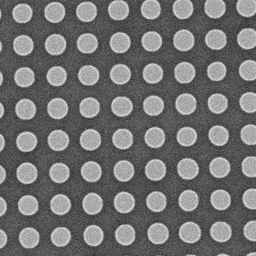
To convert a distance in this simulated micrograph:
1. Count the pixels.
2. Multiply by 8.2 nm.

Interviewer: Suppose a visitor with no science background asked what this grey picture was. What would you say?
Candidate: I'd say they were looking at an array of small figures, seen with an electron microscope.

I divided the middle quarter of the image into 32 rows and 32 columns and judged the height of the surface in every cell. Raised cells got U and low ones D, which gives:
DDDDDDDDDDDDDUUDDDDDDUUUDDDDUUUU
DDDDUUUUDDDDUUUUDDDDUUUUDDDDUUUU
DDDDUUUUUDDDUUUUUDDDUUUUUDDDUUUU
DDDDUUUUUDDDUUUUDDDDUUUUDDDDUUUU
DDDDUUUUDDDDDUUUDDDDDUUDDDDDDUUD
DDDDDDDDDDDDDDDDDDDDDDDDDDDDDDDD
DDDDDDDDDDDDDDDDDDDDDDDDDDDDDDDD
DDDDDDDDDDDDDDDDDDDDDDDDDDDDDDUD
DDDDDDDDDDDDDUUUDDDDDUUUDDDDUUUU
DDDDUUUUDDDDUUUUUDDDUUUUUDDDUUUU
UDDDUUUUUDDDUUUUUDDDUUUUUDDDUUUU
UDDDUUUUUDDDUUUUUDDDUUUUDDDDUUUU
UDDDDUUUDDDDDUUUDDDDDUUUDDDDDDDD
DDDDDDDDDDDDDDDDDDDDDDDDDDDDDDDD
DDDDDDDDDDDDDDDDDDDDDDDDDDDDDDDD
DDDDDDDDDDDDDDDDDDDDDDDDDDDDDDDD
DDDDDDUDDDDDDDUUDDDDDUUUDDDDDUUU
UDDDDUUUUDDDDUUUUDDDUUUUUDDDUUUU
UDDDUUUUUDDDUUUUUDDDUUUUUDDDUUUU
UDDDUUUUUDDDUUUUUDDDUUUUUDDDDUUU
UDDDDUUUUDDDDUUUDDDDDUUUDDDDDDDD
DDDDDDDDDDDDDDDDDDDDDDDDDDDDDDDD
DDDDDDDDDDDDDDDDDDDDDDDDDDDDDDDD
DDDDDDDDDDDDDDDDDDDDDDDDDDDDDDDD
DDDDDDUDDDDDDDUUDDDDDUUUUDDDDUUU
UDDDDUUUUDDDDUUUUDDDDUUUUDDDDUUU
UDDDUUUUUDDDDUUUUDDDUUUUUDDDDUUU
UDDDUUUUUDDDDUUUUDDDDUUUUDDDDUUU
UDDDDUUUUDDDDUUUUDDDDUUUUDDDDDUU
DDDDDDDDDDDDDDDDDDDDDDDDDDDDDDDD
DDDDDDDDDDDDDDDDDDDDDDDDDDDDDDDD
DDDDDDDDDDDDDDDDDDDDDDDDDDDDDDDD